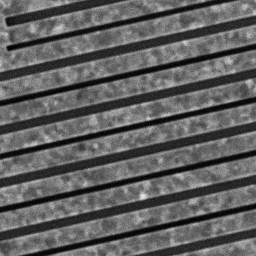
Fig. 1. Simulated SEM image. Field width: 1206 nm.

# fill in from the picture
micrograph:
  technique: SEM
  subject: parallel lines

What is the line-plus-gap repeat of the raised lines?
122 nanometres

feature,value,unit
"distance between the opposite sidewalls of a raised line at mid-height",84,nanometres